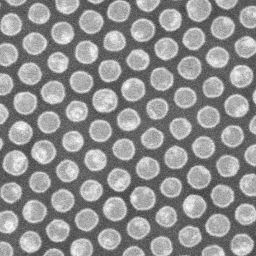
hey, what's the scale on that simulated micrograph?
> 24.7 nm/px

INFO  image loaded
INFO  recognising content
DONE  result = a regular array of raised bodies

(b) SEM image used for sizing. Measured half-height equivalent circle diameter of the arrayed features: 520 nm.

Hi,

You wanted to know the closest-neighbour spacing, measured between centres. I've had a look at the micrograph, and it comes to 733 nanometers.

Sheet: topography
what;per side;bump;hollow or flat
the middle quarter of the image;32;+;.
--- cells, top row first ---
+........+++++...++++........+++
.........+++++.........+++...+++
...+++...+++++........+++++..+++
..+++++..++++.........+++++....+
..+++++........++++...+++++.....
..+++++........+++++..++++......
...+++...++...++++++.........+++
........+++++..+++++........++++
.......++++++..++++.........++++
..++...++++++.........+++...++++
.++++...+++++........+++++...++.
.+++++..++++...++....+++++......
.+++++........++++...++++.......
.++++.........+++++...++........
........++....+++++........++++.
.......++++...++++.........++++.
.......+++++...+.....++....++++.
.+++...+++++........++++...++++.
++++...++++.........+++++...++..
+++++........++++...++++........
++++........+++++....+++........
.++.........+++++.........++++..
......++++...++++.........++++..
.....+++++....+++........++++++.
++...+++++.........++++..+++++..
+++...++++........++++++..++++..
+++.....+....+....++++++........
+++.........++++...++++........+
+++........+++++....++.........+
.....+++...+++++.........++++..+
.....++++...++++........+++++...
....+++++....++...++++..+++++...